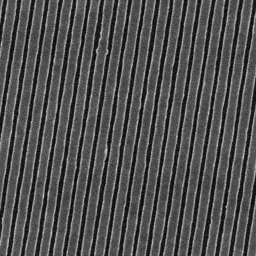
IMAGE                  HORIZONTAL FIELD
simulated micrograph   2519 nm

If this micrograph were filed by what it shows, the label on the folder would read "parallel lines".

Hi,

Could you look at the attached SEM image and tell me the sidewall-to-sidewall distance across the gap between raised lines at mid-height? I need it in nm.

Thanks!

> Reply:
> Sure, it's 45.1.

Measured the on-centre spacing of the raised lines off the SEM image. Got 135 nm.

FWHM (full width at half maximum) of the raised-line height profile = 0.0912 microns